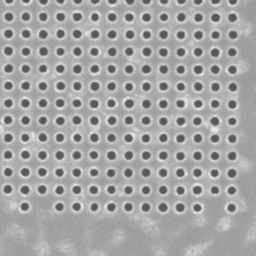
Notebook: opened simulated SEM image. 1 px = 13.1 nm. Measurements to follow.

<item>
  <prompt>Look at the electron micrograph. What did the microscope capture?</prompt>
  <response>a regular array of holes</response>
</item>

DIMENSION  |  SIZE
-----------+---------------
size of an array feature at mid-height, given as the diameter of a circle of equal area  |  117 nm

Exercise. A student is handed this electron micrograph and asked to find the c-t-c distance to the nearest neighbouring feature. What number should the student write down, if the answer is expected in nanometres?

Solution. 223